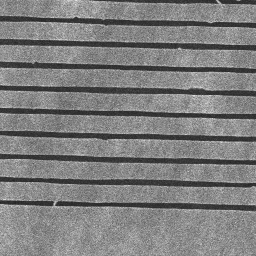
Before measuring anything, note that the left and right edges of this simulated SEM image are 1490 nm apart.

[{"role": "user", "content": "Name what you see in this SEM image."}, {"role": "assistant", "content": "parallel lines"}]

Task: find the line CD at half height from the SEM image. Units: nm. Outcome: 101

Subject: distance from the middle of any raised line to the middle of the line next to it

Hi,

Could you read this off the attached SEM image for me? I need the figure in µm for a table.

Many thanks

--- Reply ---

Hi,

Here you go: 0.133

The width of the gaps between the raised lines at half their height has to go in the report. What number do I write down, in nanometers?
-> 30.5